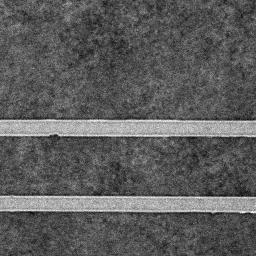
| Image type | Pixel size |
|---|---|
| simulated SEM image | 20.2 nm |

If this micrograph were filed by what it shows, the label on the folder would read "one or a few lines or trenches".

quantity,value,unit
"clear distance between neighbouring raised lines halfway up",1250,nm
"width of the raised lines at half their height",291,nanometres